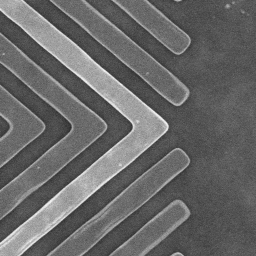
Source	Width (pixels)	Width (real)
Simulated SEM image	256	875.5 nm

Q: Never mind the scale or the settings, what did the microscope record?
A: groups of lines, slits or small figures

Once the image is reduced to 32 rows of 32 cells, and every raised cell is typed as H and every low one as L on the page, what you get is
HHHLLLLHHHHLLLLHHHHLLLLLLLLLLLLL
HHHHHLLLHHHHLLLLHHHHLLLLLLLLLLLL
LHHHHHLLLHHHHLLLLHHHHLLLLLLLLLLL
LLLHHHHLLLLHHHHLLLHHHHLLLLLLLLLL
LLLLHHHHLLLHHHHHLLLHHHHLLLLLLLLL
HHLLLHHHHLLLLHHHHLLLHHHHLLLLLLLL
HHHLLLHHHHHLLLHHHHLLLLHLLLLLLLLL
HHHHLLLHHHHLLLLHHHHLLLLLLLLLLLLL
LHHHHLLLLHHHHLLLHHHHHLLLLLLLLLLL
LLHHHHLLLLHHHHLLLHHHHHLLLLLLLLLL
LLLHHHHLLLLHHHHLLLLHHHHLLLLLLLLL
HLLLHHHHLLLLHHHHLLLLHHHLLLLLLLLL
HHLLLLHHHHLLLHHHHLLLLHHLLLLLLLLL
HHHLLLLHHHHLLLLHHHHLLLLLLLLLLLLL
HHHHHLLLHHHHLLLLHHHHLLLLLLLLLLLL
LHHHHLLLLHHHHLLLHHHHHLLLLLLLLLLL
LHHHHLLLLHHHHLLLHHHHHLLLLLLLLLLL
HHHHLLLLHHHHLLLHHHHHLLLLLLLLLLLL
HHHLLLHHHHHLLLHHHHLLLLLLLLLLLLLL
HHLLLHHHHLLLLHHHHLLLLHHLLLLLLLLL
LLLLHHHHLLLLHHHHLLLLHHHLLLLLLLLL
LLLHHHHLLLLHHHHLLLHHHHLLLLLLLLLL
LLHHHHLLLHHHHHLLLHHHHLLLLLLLLLLL
HHHHHLLLHHHHLLLLHHHHLLLLLLLLLLLL
HHHLLLLHHHHLLLLHHHHLLLLLLLLLLLLL
HHLLLLHHHHLLLLHHHHLLLLHLLLLLLLLL
HLLLLHHHHLLLLHHHHLLLHHHLLLLLLLLL
LLLLHHHHLLLHHHHLLLLHHHHLLLLLLLLL
LLHHHHHLLLHHHHLLLLHHHHLLLLLLLLLL
LHHHHLLLLHHHHLLLLHHHHLLLLLLLLLLL
HHHHLLLLHHHHLLLLHHHLLLLLLLLLLLLL
HHHLLLHHHHHLLLHHHHLLLLLLLLLLLLLL